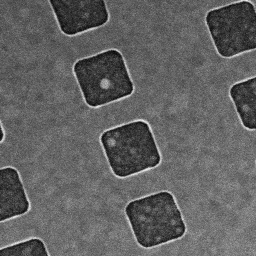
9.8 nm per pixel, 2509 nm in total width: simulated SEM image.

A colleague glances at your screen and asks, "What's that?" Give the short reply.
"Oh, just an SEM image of holes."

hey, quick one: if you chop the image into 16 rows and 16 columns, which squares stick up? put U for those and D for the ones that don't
UUUDDDDUUUUUUUDD
UUUUDDUUUUUUUDDD
UUUUUUUUUUUUUDDD
UUUUUUDDUUUUUUUU
UUUUUDDDUUUUUUUU
UUUUUDDDUUUUUUUD
UUUUUUDUUUUUUUUD
UUUUUUUUUUUUUUUD
UUUUUUUDDDUUUUUU
UUUUUUUDDDUUUUUU
UUUUUUUDDUUUUUUU
DUUUUUUUUUUUUUUU
DDUUUUUUUDDUUUUU
DUUUUUUUDDDUUUUU
UUUUUUUUDDDUUUUU
DDDUUUUUUUUUUUUU